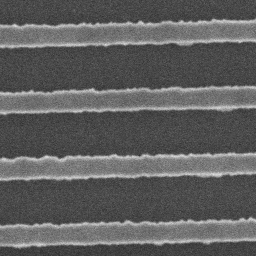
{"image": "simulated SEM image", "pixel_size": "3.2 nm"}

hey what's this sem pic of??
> lines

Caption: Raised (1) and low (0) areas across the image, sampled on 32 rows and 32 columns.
00000000000000000000000000000000
00000000000000000000000000000000
00000000000000000000000000000000
11111111111111111111111111111111
11111111111111111111111111111111
11111111111111111101100000000000
00000000000000000000000000000000
00000000000000000000000000000000
00000000000000000000000000000000
00000000000000000000000000000000
00000000000000000000000000000000
00011011111111111111111111111111
11111111111111111111111111111111
11111111111111111111111111110000
00000000000000000000000000000000
00000000000000000000000000000000
00000000000000000000000000000000
00000000000000000000000000000000
00000000000000000000000000000000
00000000000000100011111111111111
11111111111111111111111111111111
11111111111111111111111111111111
11000000000000000000000000000000
00000000000000000000000000000000
00000000000000000000000000000000
00000000000000000000000000000000
00000000000000000000000000000000
00000000000000000000000000000011
11111111111111111111111111111111
11111111111111111111111111111111
11111111111101000000000000000000
00000000000000000000000000000000